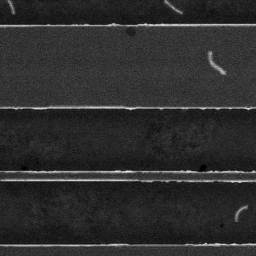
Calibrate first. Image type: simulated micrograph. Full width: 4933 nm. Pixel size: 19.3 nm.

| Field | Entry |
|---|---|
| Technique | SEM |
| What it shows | lines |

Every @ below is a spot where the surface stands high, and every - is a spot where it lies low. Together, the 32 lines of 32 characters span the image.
--------------------------------
--------------------------------
--------------------------------
@@@@@@@@@@@@@@@@@@@@@@@@@@@@@@@@
@@@@@@@@@@@@@@@@@@@@@@@@@@@@@@@@
@@@@@@@@@@@@@@@@@@@@@@@@@@@@@@@@
@@@@@@@@@@@@@@@@@@@@@@@@@@@@@@@@
@@@@@@@@@@@@@@@@@@@@@@@@@@@@@@@@
@@@@@@@@@@@@@@@@@@@@@@@@@@@@@@@@
@@@@@@@@@@@@@@@@@@@@@@@@@@@@@@@@
@@@@@@@@@@@@@@@@@@@@@@@@@@@@@@@@
@@@@@@@@@@@@@@@@@@@@@@@@@@@@@@@@
@@@@@@@@@@@@@@@@@@@@@@@@@@@@@@@@
--@-@@---------@@--------@----@@
--------------------------------
--------------------------------
--------------------------------
--------------------------------
--------------------------------
--------------------------------
--------------------------------
@@@@@@@@@@@@@@@@@@@@@@@@@--@@@@@
@@@@@@@@@@@@@@@@@@@@@@@@@@@@@@@@
--------------------------------
--------------------------------
--------------------------------
--------------------------------
--------------------------------
--------------------------------
--------------------------------
--------------------------------
@@@@@@@@@@@@@@@@@@@@@@@@@@@@@@@@